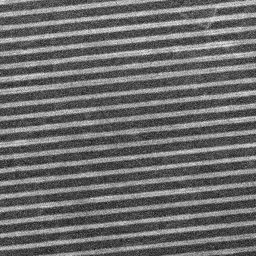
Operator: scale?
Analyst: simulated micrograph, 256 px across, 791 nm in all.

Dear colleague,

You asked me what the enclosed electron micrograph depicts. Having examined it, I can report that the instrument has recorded parallel lines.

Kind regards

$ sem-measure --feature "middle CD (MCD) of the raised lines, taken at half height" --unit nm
11.9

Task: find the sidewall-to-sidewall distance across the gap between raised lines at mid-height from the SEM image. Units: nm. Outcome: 27.6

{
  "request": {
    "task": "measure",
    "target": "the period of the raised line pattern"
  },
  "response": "39.8 nm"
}